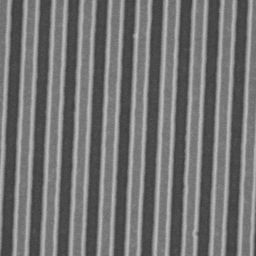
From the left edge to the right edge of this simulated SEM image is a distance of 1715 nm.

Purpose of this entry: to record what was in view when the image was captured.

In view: parallel lines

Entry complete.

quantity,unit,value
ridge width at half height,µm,0.0936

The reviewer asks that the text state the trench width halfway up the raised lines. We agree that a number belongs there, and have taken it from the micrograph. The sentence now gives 92.8 nm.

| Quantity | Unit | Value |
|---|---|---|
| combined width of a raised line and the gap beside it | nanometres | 188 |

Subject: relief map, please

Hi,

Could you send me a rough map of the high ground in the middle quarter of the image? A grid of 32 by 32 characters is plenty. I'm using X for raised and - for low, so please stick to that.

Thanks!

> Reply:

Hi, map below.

----XXX----XXX---XXXX----XXX----
---XXXX---XXXX----XXX----XXX----
---XXXX---XXXX----XXX----XXX----
---XXXX---XXXX----XXX----XXX---X
---XXXX---XXXX----XXX---XXXX---X
---XXXX---XXXX---XXXX---XXXX---X
---XXXX---XXXX---XXX----XXXX---X
---XXXX---XXXX---XXX----XXXX---X
---XXXX---XXXX---XXXX---XXXX---X
---XXXX---XXXX---XXXX---XXXX---X
---XXXX---XXXX---XXXX---XXX----X
---XXXX---XXXX---XXX----XXX----X
---XXXX---XXX----XXX----XXX----X
---XXX----XXX----XXX----XXX----X
---XXX----XXX----XXX----XXX----X
---XXX----XXX----XXX----XXX----X
---XXX----XXX----XXX----XXX----X
---XXX----XXX----XXX----XXX----X
---XXX----XXX----XXX----XXX----X
---XXX----XXX----XXX----XXX----X
---XXX----XXX----XXX----XXX----X
---XXX----XXX----XXX----XXX----X
---XXX----XXX---XXXX----XXX----X
---XXX---XXXX---XXXX---XXXX----X
--XXXX---XXXX---XXXX----XXX----X
--XXXX---XXXX---XXXX----XXX----X
--XXXX----XXX---XXXX----XXX---XX
--XXXX---XXXX---XXXX---XXXX---XX
--XXXX---XXXX---XXXX---XXXX---XX
--XXXX---XXXX---XXXX---XXXX---XX
--XXXX---XXXX---XXXX---XXXX---XX
--XXXX---XXXX---XXXX---XXXX---XX